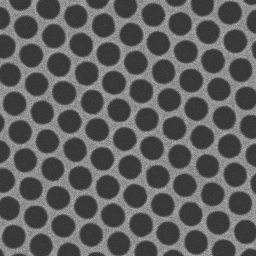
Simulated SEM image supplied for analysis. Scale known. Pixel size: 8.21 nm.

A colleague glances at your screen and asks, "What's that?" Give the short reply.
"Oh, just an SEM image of a regular array of holes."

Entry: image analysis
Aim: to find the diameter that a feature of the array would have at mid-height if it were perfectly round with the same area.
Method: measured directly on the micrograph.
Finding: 23.8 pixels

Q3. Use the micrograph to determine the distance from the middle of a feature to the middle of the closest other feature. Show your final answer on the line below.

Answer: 235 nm